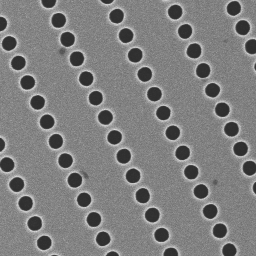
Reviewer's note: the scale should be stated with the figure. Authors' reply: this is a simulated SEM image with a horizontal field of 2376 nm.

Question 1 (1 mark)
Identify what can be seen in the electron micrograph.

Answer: a regular array of holes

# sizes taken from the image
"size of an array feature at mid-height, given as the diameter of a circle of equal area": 132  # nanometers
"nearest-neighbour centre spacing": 200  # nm